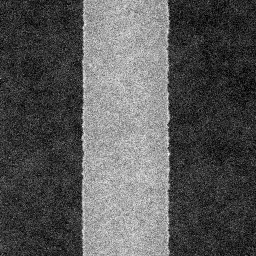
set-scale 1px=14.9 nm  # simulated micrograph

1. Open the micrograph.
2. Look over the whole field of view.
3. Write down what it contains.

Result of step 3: one or a few lines or trenches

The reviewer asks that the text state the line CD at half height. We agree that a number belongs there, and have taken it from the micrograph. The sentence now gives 1260 nm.